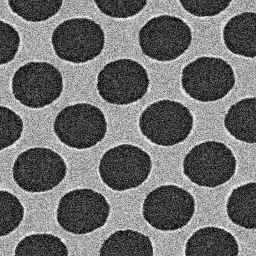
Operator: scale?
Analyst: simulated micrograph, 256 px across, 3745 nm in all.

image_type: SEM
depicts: a regular array of holes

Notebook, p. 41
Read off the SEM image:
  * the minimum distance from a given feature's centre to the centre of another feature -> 0.874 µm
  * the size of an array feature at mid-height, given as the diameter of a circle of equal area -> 732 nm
